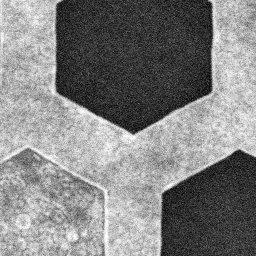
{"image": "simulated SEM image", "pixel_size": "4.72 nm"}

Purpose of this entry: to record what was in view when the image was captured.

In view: holes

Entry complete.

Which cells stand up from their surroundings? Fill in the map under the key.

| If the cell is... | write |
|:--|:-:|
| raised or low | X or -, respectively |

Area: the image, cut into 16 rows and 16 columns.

XXX----------XXX
XXX----------XXX
XXX----------XXX
XXX----------XXX
XXX----------XXX
XXXX---------XXX
XXXXX-------XXXX
XXXXXXX---XXXXXX
XXXXXXXXXXXXXXXX
X-XXXXXXXXXXXXXX
----XXXXXXXXX---
------XXXXX-----
-------XXX------
-------XXX------
-------XXX------
-------XXX------